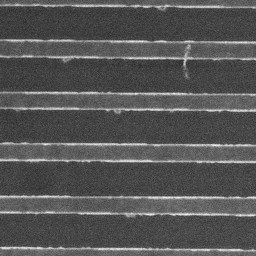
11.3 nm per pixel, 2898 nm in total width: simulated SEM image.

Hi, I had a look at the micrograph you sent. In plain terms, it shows lines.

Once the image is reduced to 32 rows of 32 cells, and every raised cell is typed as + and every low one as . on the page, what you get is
++++++++++++++++++++++++++++++++
................................
................................
................................
................................
++++++++++++++++++++++++++++++++
++++++++++++++++++++++++++++++++
................................
................................
................................
................................
................................
++++++++++++++++++++++++++++++++
++++++++++++++++++++++++++++++++
................................
................................
................................
................................
++++++++++++++++++++++++++++++++
++++++++++++++++++++++++++++++++
................................
................................
................................
................................
................................
++++++++++++++++++++++++++++++++
++++++++++++++++++++++++++++++++
................................
................................
................................
................................
++++++++++++++++++++++++++++++++